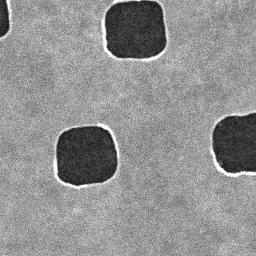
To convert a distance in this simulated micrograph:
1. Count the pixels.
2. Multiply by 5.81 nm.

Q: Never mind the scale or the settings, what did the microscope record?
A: holes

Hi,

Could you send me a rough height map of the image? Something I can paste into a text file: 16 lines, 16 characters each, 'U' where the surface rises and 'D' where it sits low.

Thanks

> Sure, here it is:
DUUUUUUDDDUUUUUU
DUUUUUUDDDUUUUUU
UUUUUUUDDDUUUUUU
UUUUUUUDDDUUUUUU
UUUUUUUUUUUUUUUU
UUUUUUUUUUUUUUUU
UUUUUUUUUUUUUUUU
UUUUUUUUUUUUUUDD
UUUUDDDUUUUUUDDD
UUUUDDDUUUUUUDDD
UUUUDDDUUUUUUUDD
UUUUDDUUUUUUUUUU
UUUUUUUUUUUUUUUU
UUUUUUUUUUUUUUUU
UUUUUUUUUUUUUUUU
UUUUUUUUUUUUUUUU